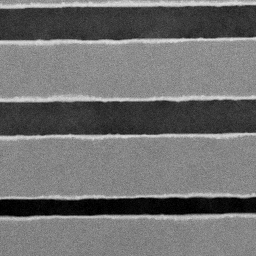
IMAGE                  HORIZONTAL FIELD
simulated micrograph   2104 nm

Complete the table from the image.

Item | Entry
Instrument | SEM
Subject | lines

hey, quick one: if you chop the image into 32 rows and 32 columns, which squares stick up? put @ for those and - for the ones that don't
@@@@@@@@@@@@@@@@@@@@@@@@@@@@@@@@
--------------------------------
--------------------------------
--------------------------------
--------------------------------
@@@@@@@@@@@@@@@@@@@@@@@@@@@@@@@@
@@@@@@@@@@@@@@@@@@@@@@@@@@@@@@@@
@@@@@@@@@@@@@@@@@@@@@@@@@@@@@@@@
@@@@@@@@@@@@@@@@@@@@@@@@@@@@@@@@
@@@@@@@@@@@@@@@@@@@@@@@@@@@@@@@@
@@@@@@@@@@@@@@@@@@@@@@@@@@@@@@@@
@@@@@@@@@@@@@@@@@@@@@@@@@@@@@@@@
@@@@@@@@@@@@@@@@@@@@-@@@--------
--------------------------------
--------------------------------
--------------------------------
--------------------------------
@@@@@@@@@@@@@@@@@@@@@@@@@@@@@@@@
@@@@@@@@@@@@@@@@@@@@@@@@@@@@@@@@
@@@@@@@@@@@@@@@@@@@@@@@@@@@@@@@@
@@@@@@@@@@@@@@@@@@@@@@@@@@@@@@@@
@@@@@@@@@@@@@@@@@@@@@@@@@@@@@@@@
@@@@@@@@@@@@@@@@@@@@@@@@@@@@@@@@
@@@@@@@@@@@@@@@@@@@@@@@@@@@@@@@@
@@@@@@@@@@@@@@@@@@@@@@@@@@@@@@@@
--------------------------------
--------------------------------
@@@@@@@@@@@@@@@@@@@@@@@@@@@@@@@@
@@@@@@@@@@@@@@@@@@@@@@@@@@@@@@@@
@@@@@@@@@@@@@@@@@@@@@@@@@@@@@@@@
@@@@@@@@@@@@@@@@@@@@@@@@@@@@@@@@
@@@@@@@@@@@@@@@@@@@@@@@@@@@@@@@@